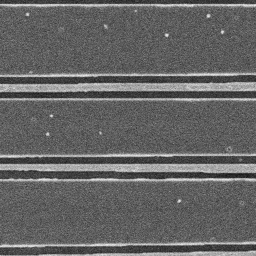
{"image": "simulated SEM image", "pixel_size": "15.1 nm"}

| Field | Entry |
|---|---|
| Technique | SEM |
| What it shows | lines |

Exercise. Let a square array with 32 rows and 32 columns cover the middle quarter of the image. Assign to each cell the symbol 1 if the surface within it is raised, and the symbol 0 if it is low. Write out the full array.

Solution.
11111111111111111111111111111111
11111111111111111111111111111111
11111111111111111111111111111111
00000000000000000000000000000000
00000000000000000000000000000000
11111111111111111111111111111111
11111111111111111111111111111111
00000000000000000000000000000000
00000000000000000000000000000000
11111111111111111111111111111111
11111111111111111111111111111111
11111111111111111111111111111111
11111111111111111111111111111111
11111111111111111111111111111111
11111111111111111111111111111111
11111111111111111111111111111111
11111111111111111111111111111111
11111111111111111111111111111111
11111111111111111111111111111111
11111111111111111111111111111111
11111111111111111111111111111111
11111111111111111111111111111111
11111111111111111111111111111111
00000000000000000000000000000000
00000000000000000000000000000000
11111111111111111111111111111111
11111111111111111111111111111111
00000000000000000000000000000000
00000000000000000000000000000000
11111111111111111111111111111111
11111111111111111111111111111111
11111111111111111111111111111111